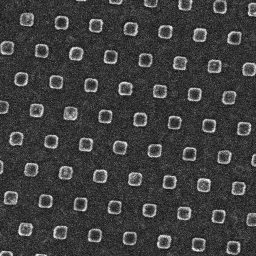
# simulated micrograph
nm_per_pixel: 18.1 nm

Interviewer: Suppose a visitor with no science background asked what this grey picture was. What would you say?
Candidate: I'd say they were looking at a regular array of raised bodies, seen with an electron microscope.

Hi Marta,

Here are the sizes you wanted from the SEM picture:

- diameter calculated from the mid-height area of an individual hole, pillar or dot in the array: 251 nm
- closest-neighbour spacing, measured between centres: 622 nanometres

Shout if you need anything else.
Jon